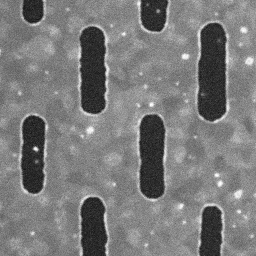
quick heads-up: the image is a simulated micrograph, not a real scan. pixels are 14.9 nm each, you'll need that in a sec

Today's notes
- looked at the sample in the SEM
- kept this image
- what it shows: holes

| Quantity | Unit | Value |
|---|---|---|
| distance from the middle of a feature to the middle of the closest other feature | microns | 1.53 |